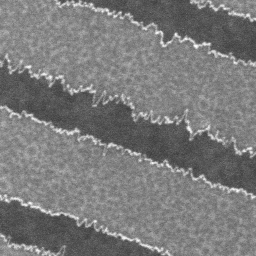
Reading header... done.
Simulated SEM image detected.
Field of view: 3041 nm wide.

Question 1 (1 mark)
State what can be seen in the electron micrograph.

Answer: one or a few lines or trenches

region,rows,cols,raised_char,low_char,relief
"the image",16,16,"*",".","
......********..
.........*******
..........*.****
..............**
**..............
****............
********........
..*********.....
.....********...
........********
...........*****
.............***
*...............
*****...........
*******.........
.*********......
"